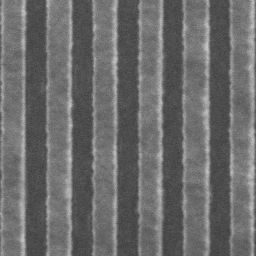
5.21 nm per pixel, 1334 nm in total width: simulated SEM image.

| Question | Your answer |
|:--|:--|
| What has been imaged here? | lines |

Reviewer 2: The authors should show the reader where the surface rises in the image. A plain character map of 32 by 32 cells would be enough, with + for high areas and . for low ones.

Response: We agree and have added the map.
+++...+++...+++..+++...+++...+++
+++...+++...+++..+++...+++...+++
+++...+++...+++..+++...+++...+++
+++...+++...+++..+++...+++...+++
+++...+++...+++..+++...+++...+++
+++...+++...+++..+++...+++...+++
+++...+++...+++..+++...+++...+++
+++...+++...+++..+++...+++...+++
+++...+++...+++..+++...+++...+++
+++...+++...+++..+++...+++...+++
+++...+++...+++..+++...+++...+++
+++...+++...+++..+++...+++...+++
+++...+++...+++..+++...+++...+++
+++...+++...+++..+++...+++...+++
+++...+++...+++..+++...+++...+++
+++...+++...+++..+++...+++...+++
+++...+++...+++..+++...+++...+++
+++...+++...+++..+++...+++...+++
+++...+++...+++..+++...+++...+++
+++...+++...+++..+++...+++...+++
+++...+++...+++..+++...+++...+++
+++...+++...+++..+++...+++...+++
+++...+++...+++..+++...+++...+++
+++...+++...+++..+++...+++...+++
+++...+++...+++..+++...+++...+++
+++...+++...+++..+++...+++...+++
+++...+++...+++..+++...+++...+++
+++...+++...+++..+++...+++...+++
+++...+++...+++..+++...+++...+++
+++...+++...+++..+++...+++...+++
+++...+++...+++..+++...+++...+++
+++...+++...+++..+++...+++...+++